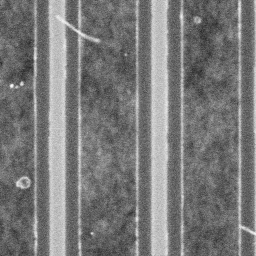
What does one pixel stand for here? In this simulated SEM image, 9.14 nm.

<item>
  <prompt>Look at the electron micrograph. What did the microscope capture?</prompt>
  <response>lines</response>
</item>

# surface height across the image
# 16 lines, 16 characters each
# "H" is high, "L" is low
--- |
HHLLLHHHHLLHHHHL
HHLLLHHHHLLHHHHL
HHLLLHHHHLLHHHHL
HHLLLHHHHLLHHHHL
HHLLLHHHHLLHHHHL
HHLLLHHHHLLHHHHL
HHLLLHHHHLLHHHHL
HHLLLHHHHLLHHHHL
HHLLLHHHHLLHHHHL
HHLLLHHHHLLHHHHL
HHLLLHHHHLLHHHHL
HHLLLHHHHLLHHHHL
HHLLLHHHHLLHHHHL
HHLLLHHHHLLHHHHL
HHLLLHHHHLLHHHHL
HHLLLHHHHLLHHHHL